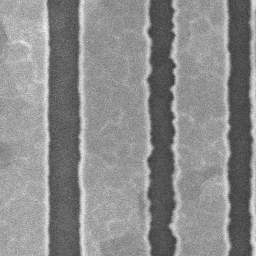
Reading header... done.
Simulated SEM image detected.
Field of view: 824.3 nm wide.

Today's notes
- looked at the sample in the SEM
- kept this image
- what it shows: one or a few lines or trenches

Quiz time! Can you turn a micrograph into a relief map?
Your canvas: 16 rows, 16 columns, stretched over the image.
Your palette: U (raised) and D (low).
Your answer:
UUUDDUUUUDDUUUDD
UUUDDUUUUDDUUUDD
UUUDDUUUUDDUUUDD
UUUDDUUUUDDUUUDD
UUUDDUUUUDDUUUDD
UUUDDUUUUDDUUUDD
UUUDDUUUUDDUUUDD
UUUDDUUUUDDUUUDD
UUUDDUUUUDDUUUDD
UUUDDUUUUDDUUUDD
UUUDDUUUUDDUUUDD
UUUDDUUUUDDUUUDD
UUUDDUUUUDDUUUDD
UUUDDUUUUDDUUUDD
UUUDDUUUUDDUUUDD
UUUDDUUUUDDUUUDD